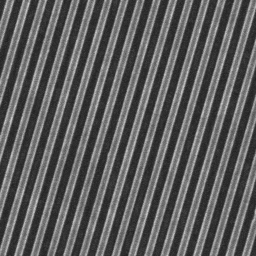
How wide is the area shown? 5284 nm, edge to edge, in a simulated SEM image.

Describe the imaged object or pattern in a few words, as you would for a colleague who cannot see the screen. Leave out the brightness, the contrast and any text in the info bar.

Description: parallel lines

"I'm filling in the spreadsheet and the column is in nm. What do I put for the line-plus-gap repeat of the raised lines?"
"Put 322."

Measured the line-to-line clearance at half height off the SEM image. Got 191 nm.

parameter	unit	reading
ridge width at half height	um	0.136